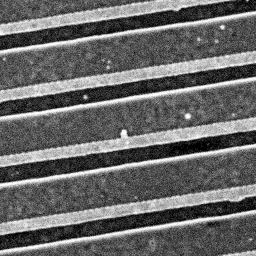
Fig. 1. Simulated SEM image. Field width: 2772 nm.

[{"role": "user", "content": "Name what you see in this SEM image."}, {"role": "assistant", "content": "lines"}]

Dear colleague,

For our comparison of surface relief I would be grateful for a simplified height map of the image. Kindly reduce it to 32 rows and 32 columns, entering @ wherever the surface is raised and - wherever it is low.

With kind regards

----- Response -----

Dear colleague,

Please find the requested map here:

@@@@@@@@@@@@@@@@@@@@@@@@@@------
@@@@@@@@@@@@@@@@@@@-------------
@@@@@@@@@@@@@-------------@@@@@@
@@@@@@-------------@@@@@@@@@@@@@
------------@@@@@@@@@@@@@@@@@@@@
------@@@@@@@@@@@@@@@@@@@@@@@@@@
@@@@@@@@@@@@@@@@@@@@@@@@@@@@@@@@
@@@@@@@@@@@@@@@@@@@@@@@@@@@@@@@@
@@@@@@@@@@@@@@@@@@@@@@@@@@@-----
@@@@@@@@@@@@@@@@@@@@@-----------
@@@@@@@@@@@@@@-------------@@@@@
@@@@@@@@------------@@@@@@@@@@@@
@-------------@@@@@@@@@@@@@@@@@@
--------@@@@@@@@@@@@@@@@@@@@@@@@
--@@@@@@@@@@@@@@@@@@@@@@@@@@@@@@
@@@@@@@@@@@@@@@@@@@@@@@@@@@@@@@@
@@@@@@@@@@@@@@@@@@@@@@@@@@@@@@--
@@@@@@@@@@@@@@@@@@@@@@@---------
@@@@@@@@@@@@@@@@-------------@@@
@@@@@@@@@@-------------@@@@@@@@@
@@--------------@@@@@@@@@@@@@@@@
----------@@@@@@@@@@@@@@@@@@@@@@
----@@@@@@@@@@@@@@@@@@@@@@@@@@@@
@@@@@@@@@@@@@@@@@@@@@@@@@@@@@@@@
@@@@@@@@@@@@@@@@@@@@@@@@@@@@@@@-
@@@@@@@@@@@@@@@@@@@@@@@@@-------
@@@@@@@@@@@@@@@@@@-------------@
@@@@@@@@@@@@------------@@@@@@@@
@@@@@-------------@@@@@@@@@@@@@@
------------@@@@@@@@@@@@@@@@@@@@
------@@@@@@@@@@@@@@@@@@@@@@@@@@
@@@@@@@@@@@@@@@@@@@@@@@@@@@@@@@@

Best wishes